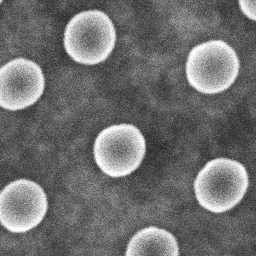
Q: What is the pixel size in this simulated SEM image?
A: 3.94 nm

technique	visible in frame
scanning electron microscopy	raised bodies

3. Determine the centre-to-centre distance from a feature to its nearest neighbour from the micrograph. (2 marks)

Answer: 440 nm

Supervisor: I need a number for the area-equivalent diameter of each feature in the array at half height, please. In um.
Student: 0.199